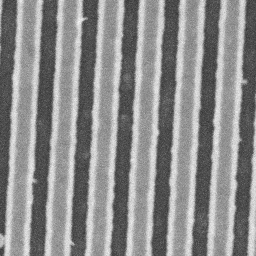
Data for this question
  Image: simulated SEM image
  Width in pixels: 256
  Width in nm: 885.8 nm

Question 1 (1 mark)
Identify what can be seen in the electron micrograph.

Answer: parallel lines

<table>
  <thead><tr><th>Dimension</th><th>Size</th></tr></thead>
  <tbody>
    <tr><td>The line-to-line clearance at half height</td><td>66.9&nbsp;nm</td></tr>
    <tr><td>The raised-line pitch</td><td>40.5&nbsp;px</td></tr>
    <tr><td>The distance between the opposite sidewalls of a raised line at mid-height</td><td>21.2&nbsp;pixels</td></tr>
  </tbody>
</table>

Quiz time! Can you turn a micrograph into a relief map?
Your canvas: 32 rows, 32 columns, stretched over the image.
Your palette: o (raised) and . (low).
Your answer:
..ooo...oo...oo...oo...oo...oo..
..ooo..ooo...oo...oo...oo...oo..
..ooo..ooo..ooo...oo...oo...oo..
..ooo..ooo...oo...oo...oo...oo..
..ooo..ooo..ooo...oo...oo...oo..
..ooo..ooo..ooo..ooo...oo...oo..
..ooo..ooo..ooo..ooo..ooo...oo..
..ooo..ooo..ooo..ooo..ooo..ooo..
..ooo..ooo..ooo..ooo..ooo..ooo..
..ooo..ooo..ooo..ooo..ooo..ooo..
..ooo..ooo..ooo..ooo..ooo..ooo..
..oo...oo...ooo..ooo..ooo..ooo..
..oo...ooo..ooo..ooo..ooo..ooo..
..oo...oo...ooo..ooo..ooo..ooo..
..oo...oo...oo...oo...ooo..ooo..
..oo...oo...oo...ooo..ooo..ooo..
..oo...oo...oo...ooo..ooo..ooo..
..oo...oo...oo...oo...oo...ooo..
.ooo...oo...oo...oo...oo...oo...
.ooo..ooo...oo...oo...oo...oo...
.ooo..ooo...oo...oo...oo...oo...
.ooo..ooo..ooo...oo...oo...oo...
.ooo..ooo..ooo..ooo...oo...oo...
.ooo..ooo..ooo..ooo...oo...oo...
.ooo..ooo..ooo..ooo..ooo...oo...
.ooo..ooo..ooo..ooo..ooo..ooo...
.ooo..ooo..ooo..ooo..ooo..ooo...
.ooo..ooo..ooo..ooo..ooo..ooo..o
.oo...ooo..ooo..ooo..ooo..ooo..o
.oo...ooo..ooo..ooo..ooo..ooo..o
.oo...ooo..ooo..ooo..ooo..ooo..o
.oo...oo...ooo..ooo..ooo..ooo..o